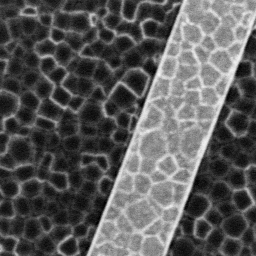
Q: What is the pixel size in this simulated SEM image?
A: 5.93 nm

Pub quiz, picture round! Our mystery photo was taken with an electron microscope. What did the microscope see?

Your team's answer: one or a few lines or trenches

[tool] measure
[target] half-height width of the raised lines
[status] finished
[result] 0.415 micrometres